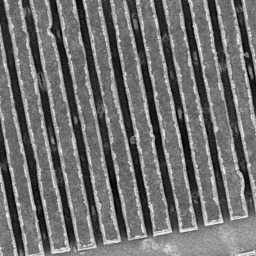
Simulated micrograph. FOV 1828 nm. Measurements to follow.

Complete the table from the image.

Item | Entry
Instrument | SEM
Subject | parallel lines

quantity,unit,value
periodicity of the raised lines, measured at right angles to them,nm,185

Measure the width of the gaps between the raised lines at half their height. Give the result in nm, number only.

61.3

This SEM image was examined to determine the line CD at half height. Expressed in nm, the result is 124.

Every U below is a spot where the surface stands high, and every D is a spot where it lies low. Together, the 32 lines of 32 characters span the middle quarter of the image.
DDUUUUDDUUUUDDUUUUUDDUUUUUDDUUUU
DDUUUUDDUUUUDDUUUUUDDUUUUUDDUUUU
DDUUUUDDDUUUDDDUUUUDDUUUUUDDUUUU
DDUUUUDDDUUUDDDUUUUDDDUUUUDDUUUU
DDUUUUDDDUUUUDDUUUUUDDUUUUDDDUUU
DDDUUUUDDUUUUDDUUUUUDDUUUUDDDUUU
DDDUUUUDDUUUUDDUUUUUDDUUUUUDDUUU
DDDUUUUDDUUUUDDDUUUUDDUUUUUDDUUU
UDDUUUUDDDUUUDDDUUUUUDDUUUUDDUUU
UDDUUUUDDDUUUUDDUUUUUDDUUUUDDDUU
UDDUUUUUDDUUUUDDUUUUUDDUUUUDDDUU
UDDDUUUUDDUUUUDDDUUUUDDUUUUDDDUU
UDDDUUUUDDUUUUDDDUUUUDDUUUUUDDUU
UUDDUUUUDDDUUUDDDUUUUDDDUUUUDDUU
UUDDUUUUDDDUUUUDDUUUUUDDUUUUDDDU
UUDDUUUUUDDUUUUDDUUUUUDDUUUUDDDU
UUDDDUUUUDDUUUUDDDUUUUDDUUUUUDDU
UUDDDUUUUDDUUUUDDDUUUUDDUUUUUDDU
UUUDDUUUUDDUUUUUDDUUUUUDDUUUUDDU
UUUDDUUUUDDDUUUUDDUUUUUDDUUUUDDU
UUUDDUUUUDDDUUUUDDUUUUUDDUUUUDDD
UUUDDDUUUUDDUUUUDDDUUUUDDUUUUUDD
UUUDDDUUUUDDUUUUDDDUUUUDDUUUUUDD
UUUUDDUUUUDDUUUUUDDUUUUDDDUUUUDD
UUUUDDUUUUDDUUUUUDDUUUUUDDUUUUDD
UUUUDDUUUUDDDUUUUDDUUUUUDDUUUUDD
UUUUDDUUUUUDDUUUUDDDUUUUDDUUUUUD
UUUUDDDUUUUDDUUUUDDDUUUUDDDUUUUD
UUUUDDDUUUUDDUUUUUDDUUUUDDUUUUUD
UUUUUDDUUUUDDUUUUUDDUUUUDDDUUUUD
DUUUUDDUUUUDDUUUUUDDUUUUUDDUUUUD
DUUUUDDUUUUUDDUUUUDDDUUUUDDUUUUD